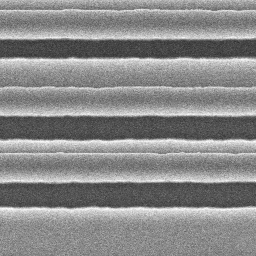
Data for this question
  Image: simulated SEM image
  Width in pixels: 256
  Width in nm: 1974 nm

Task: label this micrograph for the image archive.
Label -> lines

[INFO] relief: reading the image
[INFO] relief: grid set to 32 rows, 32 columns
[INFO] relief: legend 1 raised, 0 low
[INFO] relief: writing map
11111111111111111111111111111111
11111111111111111111111111111111
11111111111111111111111111111111
11111111111111111111111111111111
11111111111111111111111111111111
00000000000000000000000000000000
00000000000000000000000000000000
11111111111111111111111111111111
11111111111111111111111111111111
11111111111111111111111111111111
11111111111111111111111111111111
11111111111111111111111111111111
11111111111111111111111111111111
11111111111111111111111111111111
00000000000000000000000000000000
00000000000000000000000000000000
00000000000000000000000000000000
00000000000000000000000000000000
11111111111111111111111111111111
11111111111111111111111111111111
11111111111111111111111111111111
11111111111111111111111111111111
11111111111111111111111111111111
00000000000000000000000000000000
00000000000000000000000000000000
00000000000000000000000000000000
11111111111111111111111111111111
11111111111111111111111111111111
11111111111111111111111111111111
11111111111111111111111111111111
11111111111111111111111111111111
11111111111111111111111111111111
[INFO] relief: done